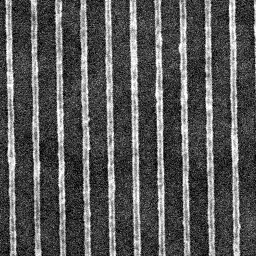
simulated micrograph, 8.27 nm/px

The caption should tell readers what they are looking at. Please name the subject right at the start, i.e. parallel lines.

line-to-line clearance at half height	19.7	px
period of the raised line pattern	205	nm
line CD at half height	42.4	nm